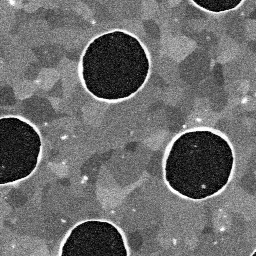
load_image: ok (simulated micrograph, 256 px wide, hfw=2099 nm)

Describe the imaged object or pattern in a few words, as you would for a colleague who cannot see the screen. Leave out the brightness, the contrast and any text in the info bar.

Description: holes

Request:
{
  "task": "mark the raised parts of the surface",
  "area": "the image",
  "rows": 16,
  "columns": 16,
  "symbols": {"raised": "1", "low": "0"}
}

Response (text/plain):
1111111111111001
1111111111111111
1111110001111111
1111100001111111
1111100001111111
1111100001111111
1111111111111111
0111111111111111
0011111111100011
0001111111000001
0011111111000001
1111111111100011
1111111111111111
1111111111111111
1111000111111111
1111000011111111